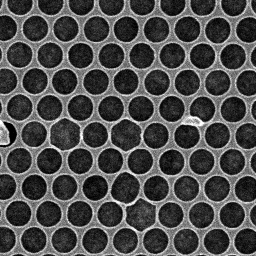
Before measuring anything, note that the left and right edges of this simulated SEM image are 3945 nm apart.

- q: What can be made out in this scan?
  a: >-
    a regular array of holes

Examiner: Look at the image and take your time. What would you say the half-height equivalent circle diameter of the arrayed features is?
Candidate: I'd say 400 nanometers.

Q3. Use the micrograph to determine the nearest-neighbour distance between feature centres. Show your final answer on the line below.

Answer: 463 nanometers